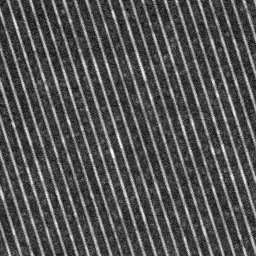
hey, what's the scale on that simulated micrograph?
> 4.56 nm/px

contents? parallel lines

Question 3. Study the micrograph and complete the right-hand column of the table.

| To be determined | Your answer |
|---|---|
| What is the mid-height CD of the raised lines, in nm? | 9.8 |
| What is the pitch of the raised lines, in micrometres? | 0.0488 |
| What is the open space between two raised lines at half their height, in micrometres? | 0.0396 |